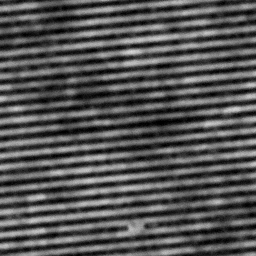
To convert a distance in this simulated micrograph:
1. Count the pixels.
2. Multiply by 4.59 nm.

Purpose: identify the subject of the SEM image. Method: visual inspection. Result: parallel lines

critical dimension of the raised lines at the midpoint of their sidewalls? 17.7 nm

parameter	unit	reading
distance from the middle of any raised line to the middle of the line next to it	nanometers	51.7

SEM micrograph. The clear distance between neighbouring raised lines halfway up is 31.4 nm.